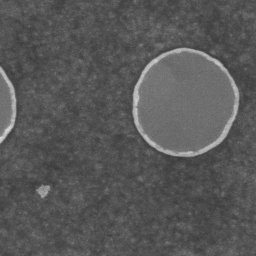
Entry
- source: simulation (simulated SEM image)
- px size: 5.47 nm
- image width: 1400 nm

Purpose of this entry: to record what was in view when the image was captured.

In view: raised bodies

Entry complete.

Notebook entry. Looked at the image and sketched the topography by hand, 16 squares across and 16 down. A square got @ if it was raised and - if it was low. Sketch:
----------------
----------------
----------------
----------@@@---
---------@@@@@--
@-------@@@@@@@-
@-------@@@@@@@-
@-------@@@@@@@-
---------@@@@@--
----------@@@---
----------------
----------------
----------------
----------------
----------------
----------------